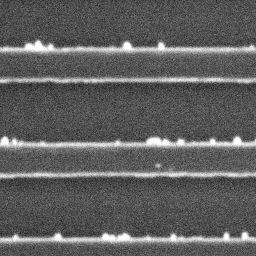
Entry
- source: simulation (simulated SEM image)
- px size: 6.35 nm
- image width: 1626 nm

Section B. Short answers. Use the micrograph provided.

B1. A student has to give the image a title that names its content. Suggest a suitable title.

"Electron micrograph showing lines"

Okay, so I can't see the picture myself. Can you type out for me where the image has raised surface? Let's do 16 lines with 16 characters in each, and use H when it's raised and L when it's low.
LLLLLLLLLLLLLLLL
LLLLLLLLLLLLLLLL
LLLLLLLLLLLLLLLL
HHHHHHHHHHHHHHHH
HHHHHHHHHHHHHHHH
LLLLLLLLLLLLLLLL
LLLLLLLLLLLLLLLL
LLLLLLLLLLLLLLLL
LLLLLLLLLLLLLLLL
HHHHHHHHHHHHHHHH
HHHHHHHHHHHHHHHH
LLLLLLLLLLLLLLLL
LLLLLLLLLLLLLLLL
LLLLLLLLLLLLLLLL
LLLLLLLLLLLLLLLL
HHHHHHHHHHHHHHHH